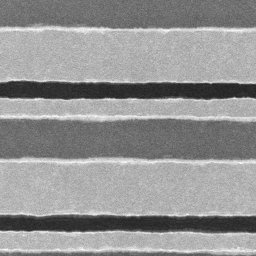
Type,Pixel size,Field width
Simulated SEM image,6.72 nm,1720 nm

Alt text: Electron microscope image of lines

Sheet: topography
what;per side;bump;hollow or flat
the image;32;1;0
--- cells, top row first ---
00000000000000000000000000000000
00000000000000000000000000000000
00000000000000000000000000000000
00000000000000000000000000000000
11111111111111111111111111111111
11111111111111111111111111111111
11111111111111111111111111111111
11111111111111111111111111111111
11111111111111111111111111111111
11111111111111111111111111111111
00000000000000000000000000000000
00000000000000000000000000000000
11111111111111111111111111111111
11111111111111111111111111111111
11111111111111111111111111111111
00000000000000000000000000000000
00000000000000000000000000000000
00000000000000000000000000000000
00000000000000000000000000000000
00000000000000000000000000000000
11111111111111111111111111111111
11111111111111111111111111111111
11111111111111111111111111111111
11111111111111111111111111111111
11111111111111111111111111111111
11111111111111111111111111111111
11111111111111111111111111111111
00000000000000000000000000000000
00000000000000000000000000000000
11111111111111111111111111111111
11111111111111111111111111111111
00000000000000000000000000000000